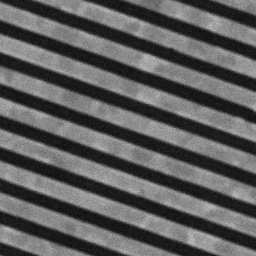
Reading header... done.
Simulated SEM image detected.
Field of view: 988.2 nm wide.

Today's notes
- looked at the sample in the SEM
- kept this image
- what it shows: parallel lines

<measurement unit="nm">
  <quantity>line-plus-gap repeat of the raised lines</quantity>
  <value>115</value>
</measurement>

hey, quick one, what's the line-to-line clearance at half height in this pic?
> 53.8 nm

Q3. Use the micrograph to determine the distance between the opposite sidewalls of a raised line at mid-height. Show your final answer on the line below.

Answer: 61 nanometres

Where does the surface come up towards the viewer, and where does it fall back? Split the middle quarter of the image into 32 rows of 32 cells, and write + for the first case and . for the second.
++++++...........++++++++++++...
+++++++++...........++++++++++++
++++++++++++...........+++++++++
...++++++++++++..........+++++++
......++++++++++++..........++++
.........++++++++++++..........+
............+++++++++++.........
+++...........++++++++++++......
++++++...........++++++++++++...
+++++++++...........+++++++++++.
++++++++++++...........+++++++++
...++++++++++++...........++++++
......+++++++++++............+++
........++++++++++++...........+
+..........++++++++++++.........
++++..........++++++++++++......
++++++............+++++++++++...
+++++++++...........++++++++++++
.+++++++++++...........+++++++++
...++++++++++++...........++++++
......++++++++++++...........+++
.........++++++++++++...........
+...........+++++++++++.........
++++..........++++++++++++......
+++++++..........++++++++++++...
++++++++++..........++++++++++++
.++++++++++++..........+++++++++
....+++++++++++...........++++++
......++++++++++++...........+++
.........++++++++++++...........
++..........++++++++++++........
++++...........++++++++++++.....